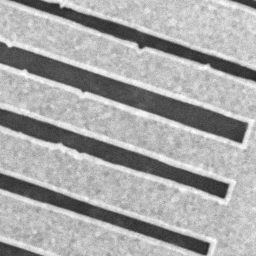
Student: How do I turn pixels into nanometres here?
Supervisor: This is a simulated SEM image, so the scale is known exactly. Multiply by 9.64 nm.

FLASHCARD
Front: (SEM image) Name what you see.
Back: one or a few lines or trenches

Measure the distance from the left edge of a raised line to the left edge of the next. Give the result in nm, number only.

595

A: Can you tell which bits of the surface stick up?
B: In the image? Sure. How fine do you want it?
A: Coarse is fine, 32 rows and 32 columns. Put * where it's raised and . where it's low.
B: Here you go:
*.......*********************...
****.......*********************
********......******************
**********.......***************
*************.......************
.***************.......*********
.....***************......******
........***************......***
*..........***************......
****..........***************...
*******..........***************
**********..........************
*************..........*********
.***************...........*****
....***************..........***
.......***************.........*
*.........***************......*
****..........**************...*
********........****************
**********..........************
*************.........**********
.****************........*******
....****************........****
......*****************......***
**.......*****************..****
*****.......********************
********.......*****************
***********........*************
**************.......***********
*****************........*******
..*******************......*****
.....******************...******